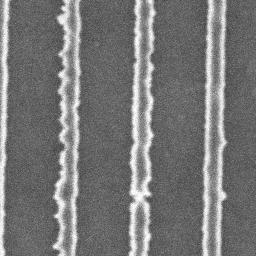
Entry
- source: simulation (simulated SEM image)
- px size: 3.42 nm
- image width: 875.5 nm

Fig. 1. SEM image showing one or a few lines or trenches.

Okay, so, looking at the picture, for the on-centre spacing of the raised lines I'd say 72.4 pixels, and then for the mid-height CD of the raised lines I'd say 52.5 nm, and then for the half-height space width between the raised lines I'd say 197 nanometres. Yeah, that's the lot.